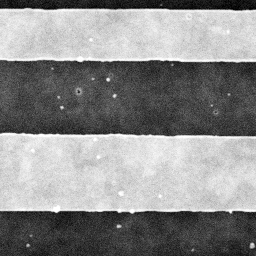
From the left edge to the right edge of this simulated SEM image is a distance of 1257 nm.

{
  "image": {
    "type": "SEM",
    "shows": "lines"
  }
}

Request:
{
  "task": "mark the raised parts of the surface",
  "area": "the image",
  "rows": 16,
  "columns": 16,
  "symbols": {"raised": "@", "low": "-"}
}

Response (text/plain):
----------------
@@@@@@@@@@@@@@@@
@@@@@@@@@@@@@@@@
@@@@@@@@@@@@@@@@
----------------
----------------
----------------
----------------
@@@@@@@@@@------
@@@@@@@@@@@@@@@@
@@@@@@@@@@@@@@@@
@@@@@@@@@@@@@@@@
@@@@@@@@@@@@@@@@
----------------
----------------
----------------